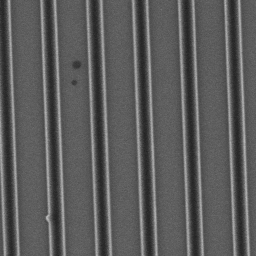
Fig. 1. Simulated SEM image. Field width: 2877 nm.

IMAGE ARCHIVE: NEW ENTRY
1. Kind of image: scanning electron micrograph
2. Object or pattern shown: parallel lines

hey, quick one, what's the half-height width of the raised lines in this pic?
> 170 nm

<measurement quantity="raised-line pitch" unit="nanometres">517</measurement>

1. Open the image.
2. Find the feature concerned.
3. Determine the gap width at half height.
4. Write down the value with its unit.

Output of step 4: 351 nm